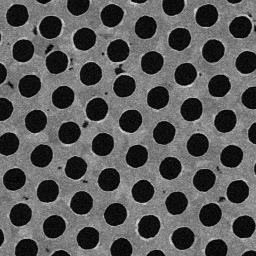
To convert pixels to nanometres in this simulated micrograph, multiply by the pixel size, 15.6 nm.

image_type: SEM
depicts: a regular array of holes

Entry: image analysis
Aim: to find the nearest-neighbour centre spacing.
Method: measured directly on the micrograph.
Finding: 553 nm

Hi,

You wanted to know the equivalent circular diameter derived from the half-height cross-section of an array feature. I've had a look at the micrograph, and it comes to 23.3 pixels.